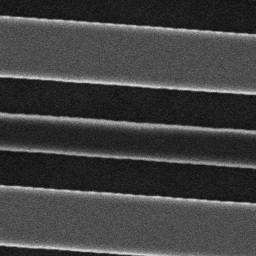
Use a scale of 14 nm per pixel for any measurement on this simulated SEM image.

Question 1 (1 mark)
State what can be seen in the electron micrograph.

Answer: lines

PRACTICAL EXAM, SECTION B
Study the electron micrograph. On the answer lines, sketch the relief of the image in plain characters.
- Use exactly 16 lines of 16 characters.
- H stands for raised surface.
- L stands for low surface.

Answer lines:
LLLLLLLLLLLLLLLL
HHHHHHHLLLLLLLLL
HHHHHHHHHHHHHHHH
HHHHHHHHHHHHHHHH
HHHHHHHHHHHHHHHH
LLLLLLLLLLHHHHHH
LLLLLLLLLLLLLLLL
HHHHHHLLLLLLLLLL
HHHHHHHHHHHHHHHH
LLHHHHHHHHHHHHHH
LLLLLLLLLLLLLLLL
LLLLLLLLLLLLLLLL
HHHHHHHHHHHHHLLL
HHHHHHHHHHHHHHHH
HHHHHHHHHHHHHHHH
LLLHHHHHHHHHHHHH